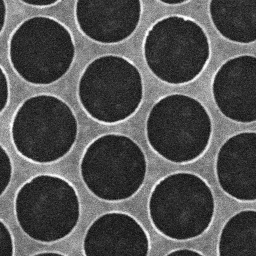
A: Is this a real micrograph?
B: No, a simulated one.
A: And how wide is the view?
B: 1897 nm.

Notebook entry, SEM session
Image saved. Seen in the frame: a regular array of holes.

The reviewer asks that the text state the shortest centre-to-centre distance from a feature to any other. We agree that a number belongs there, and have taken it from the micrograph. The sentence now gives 571 nm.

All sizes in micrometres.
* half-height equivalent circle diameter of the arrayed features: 0.491